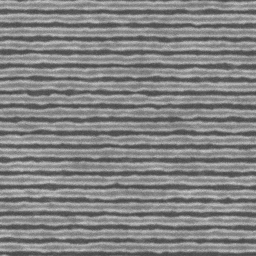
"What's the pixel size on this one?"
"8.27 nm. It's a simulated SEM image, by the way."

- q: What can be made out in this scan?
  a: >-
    parallel lines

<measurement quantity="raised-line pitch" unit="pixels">13.5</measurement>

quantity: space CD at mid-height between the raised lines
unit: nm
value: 57.9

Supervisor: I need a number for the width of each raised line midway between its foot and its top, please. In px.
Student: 7